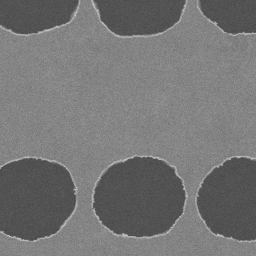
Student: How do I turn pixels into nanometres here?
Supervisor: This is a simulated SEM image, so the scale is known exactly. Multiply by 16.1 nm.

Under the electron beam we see holes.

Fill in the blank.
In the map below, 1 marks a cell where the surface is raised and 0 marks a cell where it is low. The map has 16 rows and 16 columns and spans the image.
0000010000011000
0000111000011000
1111111111111111
1111111111111111
1111111111111111
1111111111111111
1111111111111111
1111111111111111
1111111111111111
1111111111111111
0000111000011100
0000010000011000
0000010000000000
0000110000011000
0001111000111000
1111111111111111